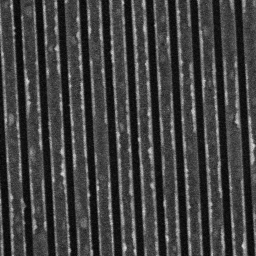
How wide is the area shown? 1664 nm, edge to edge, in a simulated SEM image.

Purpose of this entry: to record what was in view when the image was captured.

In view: parallel lines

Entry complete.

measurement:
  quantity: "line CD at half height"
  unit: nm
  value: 93.3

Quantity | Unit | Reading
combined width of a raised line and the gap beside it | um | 0.144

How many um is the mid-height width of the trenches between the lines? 0.0495